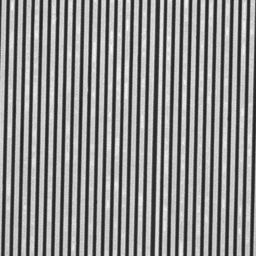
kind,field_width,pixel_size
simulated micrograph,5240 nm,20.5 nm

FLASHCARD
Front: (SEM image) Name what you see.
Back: parallel lines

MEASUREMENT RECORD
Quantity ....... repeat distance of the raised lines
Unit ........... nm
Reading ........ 170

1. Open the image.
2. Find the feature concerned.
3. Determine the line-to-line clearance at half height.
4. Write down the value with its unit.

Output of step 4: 3.5 px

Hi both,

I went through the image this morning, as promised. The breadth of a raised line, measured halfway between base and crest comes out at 92.1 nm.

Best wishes